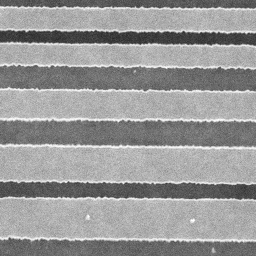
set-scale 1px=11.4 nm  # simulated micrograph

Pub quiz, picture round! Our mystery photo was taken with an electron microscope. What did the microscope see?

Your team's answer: lines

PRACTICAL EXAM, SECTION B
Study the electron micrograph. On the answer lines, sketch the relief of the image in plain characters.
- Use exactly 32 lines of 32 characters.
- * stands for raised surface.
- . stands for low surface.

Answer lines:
................................
********************************
********************************
********************************
................................
********........................
********************************
********************************
.......................*.*..*.**
................................
................................
********************************
********************************
********************************
********************************
................................
................................
................................
********************************
********************************
********************************
********************************
********************************
................................
................................
********************************
********************************
********************************
********************************
********************************
................................
................................